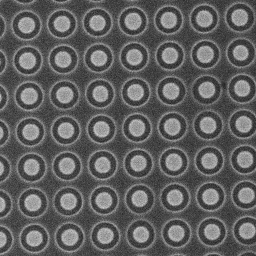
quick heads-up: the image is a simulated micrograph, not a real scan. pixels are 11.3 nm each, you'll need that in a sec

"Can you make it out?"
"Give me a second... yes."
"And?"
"an array of small figures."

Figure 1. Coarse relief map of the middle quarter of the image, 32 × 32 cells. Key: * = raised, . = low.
...***......***.....****.....***
..*****....*****...*************
********************************
**************************..****
.******....*****....****......**
...***......***......***......**
...***......***......**.......**
....*........*.......**.......**
....**......***......***......**
...***......***.....*****....***
..*****....******..*************
********************************
******************.*******...***
..*****.....****.....***......**
...***......***......***.......*
....**.......**.......**.......*
....**.......**.......**.......*
....**.......**......***......**
...****.....****.....****....***
..******...*******.*************
********************************
******************.*******...***
..*****.....****.....****.....**
....***......**.......**.......*
....**.......**.......**.......*
....**.......**.......**.......*
....**.......**.......**......**
....***.....****.....*****...***
...*****...*******.*************
********************************
******************..******....**
...*****....****......***......*